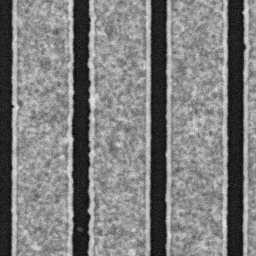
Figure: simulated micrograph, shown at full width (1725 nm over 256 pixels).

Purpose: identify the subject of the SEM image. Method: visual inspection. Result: one or a few lines or trenches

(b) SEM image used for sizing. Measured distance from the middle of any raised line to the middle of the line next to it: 521 nm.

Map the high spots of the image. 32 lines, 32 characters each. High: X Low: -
--XXXXXXX--XXXXXXX---XXXXXXX---X
--XXXXXXX---XXXXXXX--XXXXXXX---X
--XXXXXXX---XXXXXXX--XXXXXXX---X
--XXXXXXX---XXXXXX---XXXXXXX---X
--XXXXXXX---XXXXXXX--XXXXXXX---X
--XXXXXXX--XXXXXXXX--XXXXXXX---X
--XXXXXXX---XXXXXXX--XXXXXXX---X
--XXXXXXX--XXXXXXX---XXXXXXX---X
--XXXXXXX---XXXXXXX--XXXXXXX---X
--XXXXXXX--XXXXXXX---XXXXXXX---X
--XXXXXXX---XXXXXX---XXXXXXX---X
--XXXXXXX---XXXXXXX--XXXXXXX---X
--XXXXXXX---XXXXXX---XXXXXXX---X
--XXXXXXX---XXXXXX---XXXXXXX---X
--XXXXXXX---XXXXXXX--XXXXXXX---X
--XXXXXXX---XXXXXXX--XXXXXXX---X
--XXXXXXX---XXXXXX---XXXXXXX---X
--XXXXXXX--XXXXXXXX--XXXXXXX---X
--XXXXXXX---XXXXXX---XXXXXXX---X
--XXXXXXX---XXXXXX---XXXXXXX---X
--XXXXXXX--XXXXXXX---XXXXXXX---X
--XXXXXXX--XXXXXXX---XXXXXXX---X
--XXXXXXX--XXXXXXXX--XXXXXXX---X
--XXXXXXX--XXXXXXX---XXXXXXX---X
--XXXXXXX--XXXXXXX---XXXXXXX---X
--XXXXXXX--XXXXXXX---XXXXXXX---X
--XXXXXXX--XXXXXXX---XXXXXXX---X
--XXXXXXX--XXXXXXXX--XXXXXXX---X
--XXXXXXX--XXXXXXX---XXXXXXX---X
--XXXXXXX--XXXXXXX---XXXXXXX---X
--XXXXXXX--XXXXXXXX--XXXXXXX---X
--XXXXXXX--XXXXXXXX--XXXXXXX---X